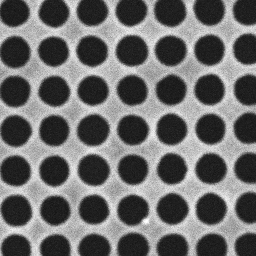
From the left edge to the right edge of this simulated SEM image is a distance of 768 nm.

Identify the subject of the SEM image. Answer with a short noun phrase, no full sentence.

a regular array of holes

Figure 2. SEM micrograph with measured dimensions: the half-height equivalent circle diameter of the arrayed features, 95.5 nm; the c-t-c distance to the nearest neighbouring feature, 38.7 pixels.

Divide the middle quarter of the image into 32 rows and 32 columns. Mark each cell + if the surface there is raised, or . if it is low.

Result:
++++++..+++++++....++++++...++++
++++++++++++++++++++++++++++++++
++++++++++++++++++++++++++.+++++
+++++.....+++++....++++++....+++
.+++.......+++......+++.......++
.++........++........++........+
..+........++........++........+
..+........++........++........+
.+++.......+++.......++.......++
.++++.....+++++.....++++.....+++
++++++++++++++++..++++++++++++++
++++++++++++++++++++++++++++++++
+++++++.+++++++++++++++++...++++
+++++.....++++......++++......++
.+++.......+++.......++.......++
.++........++........++........+
..+.........+........++........+
.++........++........++........+
.++........+++.......++.......++
++++......+++++.....++++.....+++
++++++..++++++++++++++++++++++++
++++++++++++++++++++++++++++++++
+++++++.++++++++..+++++++...++++
++++......++++......++++......++
.+++.......+++.......+++......++
.++........++........++........+
.++.........+........++........+
.+++.......+++.......++........+
.+++.......+++......++++......++
+++++.....+++++.....+++++.....++
+++++++..++++++++.++++++++++++++
++++++++++++++++++++++++++++++++